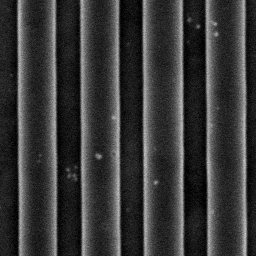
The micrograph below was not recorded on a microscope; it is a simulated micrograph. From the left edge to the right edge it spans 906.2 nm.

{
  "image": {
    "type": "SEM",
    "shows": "wiring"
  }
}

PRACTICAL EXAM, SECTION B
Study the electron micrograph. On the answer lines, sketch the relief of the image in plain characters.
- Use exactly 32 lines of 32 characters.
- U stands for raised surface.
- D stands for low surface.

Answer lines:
DDUUUUUDDDUUUUUDDDUUUUUDDDUUUUUD
DDUUUUUDDDUUUUUDDDUUUUUDDDUUUUUD
DDUUUUUDDDUUUUUDDDUUUUUDDDUUUUUD
DDUUUUUDDDUUUUUDDDUUUUUDDDUUUUUD
DDUUUUUDDDUUUUUDDDUUUUUDDDUUUUUD
DDUUUUUDDDUUUUUDDDUUUUUDDDUUUUUD
DDUUUUUDDDUUUUUDDDUUUUUDDDUUUUUD
DDUUUUUDDDUUUUUDDDUUUUUDDDUUUUUD
DDUUUUUDDDUUUUUDDDUUUUUDDDUUUUUD
DDUUUUUDDDUUUUUDDDUUUUUDDDUUUUUD
DDUUUUUDDDUUUUUDDDUUUUUDDDUUUUUD
DDUUUUUDDDUUUUUDDDUUUUUDDDUUUUUD
DDUUUUUDDDUUUUUDDDUUUUUDDDUUUUUD
DDUUUUUDDDUUUUUDDDUUUUUDDDUUUUUD
DDUUUUUDDDUUUUUDDDUUUUUDDDUUUUUD
DDUUUUUDDDUUUUUDDDUUUUUDDDUUUUUD
DDUUUUUDDDUUUUUDDDUUUUUDDDUUUUUD
DDUUUUUDDDUUUUUDDDUUUUUDDDUUUUUD
DDUUUUUDDDUUUUUDDDUUUUUDDDUUUUUD
DDUUUUUDDDUUUUUDDDUUUUUDDDUUUUUD
DDUUUUUDDDUUUUUDDDUUUUUDDDUUUUUD
DDUUUUUDDDUUUUUDDDUUUUUDDDUUUUUD
DDUUUUUDDDUUUUUDDDUUUUUDDDUUUUUD
DDUUUUUDDDUUUUUDDDUUUUUDDDUUUUUD
DDUUUUUDDDUUUUUDDDUUUUUDDDUUUUUD
DDUUUUUDDDUUUUUDDDUUUUUDDDUUUUUD
DDUUUUUDDDUUUUUDDDUUUUUDDDUUUUUD
DDUUUUUDDDUUUUUDDDUUUUUDDDUUUUUD
DDUUUUUDDDUUUUUDDDUUUUUDDDUUUUUD
DDUUUUUDDDUUUUUDDDUUUUUDDDUUUUUD
DDUUUUUDDDUUUUUDDDUUUUUDDDUUUUUD
DDUUUUUDDDUUUUUDDDUUUUUDDDUUUUUD